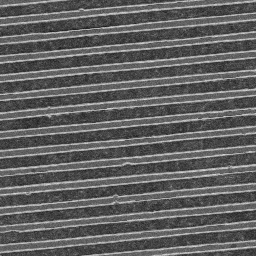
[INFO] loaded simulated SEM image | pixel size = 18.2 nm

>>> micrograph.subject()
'parallel lines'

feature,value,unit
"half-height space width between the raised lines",220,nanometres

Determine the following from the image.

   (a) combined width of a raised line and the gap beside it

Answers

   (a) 343 nm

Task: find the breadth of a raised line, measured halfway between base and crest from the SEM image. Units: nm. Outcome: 124